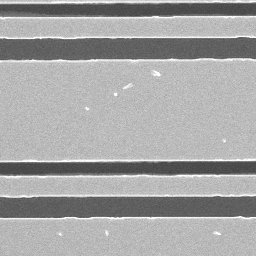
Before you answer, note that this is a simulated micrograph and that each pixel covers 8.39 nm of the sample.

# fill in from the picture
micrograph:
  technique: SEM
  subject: lines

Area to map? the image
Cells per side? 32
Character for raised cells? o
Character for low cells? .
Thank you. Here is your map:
................................
................................
oooooooooooooooooooooooooooooooo
oooooooooooooooooooooooooooooooo
oooooooooooooooooooooooooooooooo
................................
................................
.....................o..ooo.oooo
oooooooooooooooooooooooooooooooo
oooooooooooooooooooooooooooooooo
oooooooooooooooooooooooooooooooo
oooooooooooooooooooooooooooooooo
oooooooooooooooooooooooooooooooo
oooooooooooooooooooooooooooooooo
oooooooooooooooooooooooooooooooo
oooooooooooooooooooooooooooooooo
oooooooooooooooooooooooooooooooo
oooooooooooooooooooooooooooooooo
oooooooooooooooooooooooooooooooo
oooooooooooooooooooooooooooooooo
................................
................................
oooooooooooooooooooooooooooooooo
oooooooooooooooooooooooooooooooo
oooo............................
................................
................................
oooooooooooooooooooooooooooooooo
oooooooooooooooooooooooooooooooo
oooooooooooooooooooooooooooooooo
oooooooooooooooooooooooooooooooo
oooooooooooooooooooooooooooooooo